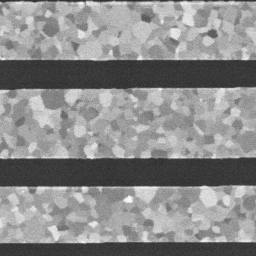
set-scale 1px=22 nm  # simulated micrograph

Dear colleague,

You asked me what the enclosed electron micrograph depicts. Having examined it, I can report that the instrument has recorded lines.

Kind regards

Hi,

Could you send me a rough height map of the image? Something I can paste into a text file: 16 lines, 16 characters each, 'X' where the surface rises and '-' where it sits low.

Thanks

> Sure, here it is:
XXXXXXXXXXXXXXXX
XXXXXXXXXXXXXXXX
XXXXXXXXXXXXXXXX
XXXXXXXXXXXXXXXX
----------------
----------------
XXXXXXXXXXXXXXXX
XXXXXXXXXXXXXXXX
XXXXXXXXXXXXXXXX
XXXXXXXXXXXXXXXX
----------------
----------------
XXXXXXXXXXXXXXXX
XXXXXXXXXXXXXXXX
XXXXXXXXXXXXXXXX
----------------